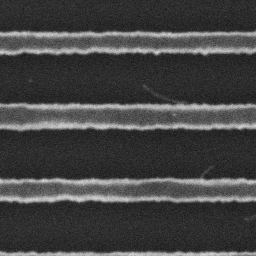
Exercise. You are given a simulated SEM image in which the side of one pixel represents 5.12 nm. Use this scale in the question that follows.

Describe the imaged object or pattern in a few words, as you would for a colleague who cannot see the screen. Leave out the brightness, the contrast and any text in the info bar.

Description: lines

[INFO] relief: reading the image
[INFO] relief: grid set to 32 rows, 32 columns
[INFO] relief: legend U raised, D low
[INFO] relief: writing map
DDDDDDDDDDDDDDDDDDDDDDDDDDDDDDDD
DDDDDDDDDDDDDDDDDDDDDDDDDDDDDDDD
DDDDDDDDDDDDDDDDDDDDDDDDDDDDDDDD
DDDDDDDDDDDDDDDDDDDDDDDDDDDDDDDD
UUUUUUUUUUUUUUUUUUUUUUUUUUUUUUUU
UUUUUUUUUUUUUUUUUUUUUUUUUUUUUUUU
UUUUUUUUUUUDDUUUUDUUDUUUUUUUUUUU
DDDDDDDDDDDDDDDDDDDDDDDDDDDDDDDD
DDDDDDDDDDDDDDDDDDDDDDDDDDDDDDDD
DDDDDDDDDDDDDDDDDDDDDDDDDDDDDDDD
DDDDDDDDDDDDDDDDDDDDDDDDDDDDDDDD
DDDDDDDDDDDDDDDDDDDDDDDDDDDDDDDD
DDDDDDDDDDDDDDDDDDDDDDDDDDDDDDDD
UUUUUUUUUUUUUUUUUUUUUUUUUUUUUUUU
UUUUUUUUUUUUUUUUUUUUUUUUUUUUUUUU
UUUUUUUUUUUUUUUUUUUUUUUUUUUUUUUU
DDDDDDDDDDDDDDDDDDDDDDDDDDDDDDDD
DDDDDDDDDDDDDDDDDDDDDDDDDDDDDDDD
DDDDDDDDDDDDDDDDDDDDDDDDDDDDDDDD
DDDDDDDDDDDDDDDDDDDDDDDDDDDDDDDD
DDDDDDDDDDDDDDDDDDDDDDDDDDDDDDDD
DDDDDDDDDDDDDDDDDDDDDDDDDDDDDDDD
UUUUUUUUDDUUUDUUUDUUUUUUUUDUUUUD
UUUUUUUUUUUUUUUUUUUUUUUUUUUUUUUU
UUUUUUUUUUUUUUUUUUUUUUUUUUUUUUUU
DDDDDDDDDDDDDDDDDDDDDDDDDDDDDDDD
DDDDDDDDDDDDDDDDDDDDDDDDDDDDDDDD
DDDDDDDDDDDDDDDDDDDDDDDDDDDDDDDD
DDDDDDDDDDDDDDDDDDDDDDDDDDDDDDDD
DDDDDDDDDDDDDDDDDDDDDDDDDDDDDDDD
DDDDDDDDDDDDDDDDDDDDDDDDDDDDDDDD
DDDDDDDDDDDDDDDDDDDDDDDDDDDDDDDD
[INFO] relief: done